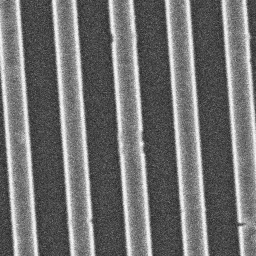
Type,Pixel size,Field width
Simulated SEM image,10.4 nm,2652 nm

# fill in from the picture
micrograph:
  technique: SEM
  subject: parallel lines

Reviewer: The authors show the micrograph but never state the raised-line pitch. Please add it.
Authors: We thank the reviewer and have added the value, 585 nm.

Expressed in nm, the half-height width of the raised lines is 222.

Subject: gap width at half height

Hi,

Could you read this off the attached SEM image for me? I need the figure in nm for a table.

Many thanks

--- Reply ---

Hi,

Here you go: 363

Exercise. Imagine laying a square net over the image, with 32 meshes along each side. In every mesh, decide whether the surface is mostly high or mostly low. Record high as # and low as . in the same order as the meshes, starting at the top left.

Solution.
##.....##.....##.....###....###.
##.....##.....###....###....###.
##.....##.....###....###....###.
##.....##.....###....###....###.
##.....###....###....###....###.
###....###....###....###....###.
###....###....###....###....###.
###....###....###....###....###.
###....###....###....###.....##.
###....###....###.....##.....##.
###....###.....##.....##.....##.
###.....##.....##.....##.....##.
.##.....##.....##.....##.....##.
.##.....##.....##.....##.....###
.##.....##.....##.....###....###
.##.....##.....###....###....###
.##.....##.....###....###....###
.##.....##.....###....###....###
.##.....###....###....###....###
.###....###....###....###....###
.###....###....###....###....###
.###....###....###....###.....##
.###....###....###.....##.....##
.###....###.....##.....##.....##
.###.....##.....##.....##.....##
..##.....##.....##.....##.....##
..##.....##.....##.....###....##
..##.....##.....##.....###....##
..##.....##.....###....###....##
..##.....##.....###....###....##
..##.....##.....###....###....##
..##.....###....###....###....##